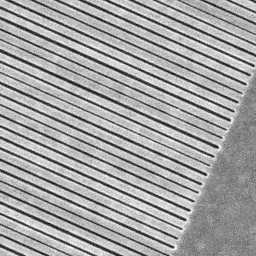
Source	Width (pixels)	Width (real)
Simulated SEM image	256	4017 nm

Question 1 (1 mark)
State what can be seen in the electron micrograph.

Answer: parallel lines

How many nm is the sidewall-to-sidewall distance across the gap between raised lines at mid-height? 43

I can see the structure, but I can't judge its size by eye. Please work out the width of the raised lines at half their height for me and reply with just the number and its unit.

113 nm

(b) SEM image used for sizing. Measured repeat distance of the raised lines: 155 nm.